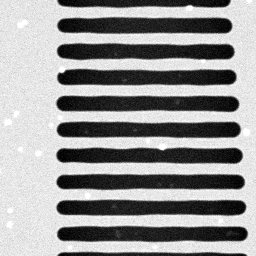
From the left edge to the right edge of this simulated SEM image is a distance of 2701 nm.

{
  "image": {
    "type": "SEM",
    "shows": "groups of lines, slits or small figures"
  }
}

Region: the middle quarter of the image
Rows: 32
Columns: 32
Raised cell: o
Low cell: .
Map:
oooooooooooooooooooooooooooooooo
......................oooo......
................................
................................
................................
oooooooooooooooooooooooooooooooo
oooooooooooooooooooooooooooooooo
oooooooooooooooooooooooooooooooo
................................
................................
................................
................................
oooooooooooooooooooooooooooooooo
oooooooooooooooooooooooooooooooo
...................oooooo.......
................................
................................
................................
oooooooooooooooooooooooooooooooo
oooooooooooooooooooooooooooooooo
oooooooooooooooooooooooooooooooo
................................
................................
................................
................................
oooooooooooooooooooooooooooooooo
oooooooooooooooooooooooooooooooo
................................
................................
................................
................................
..ooooo.........ooooooooooooooo.